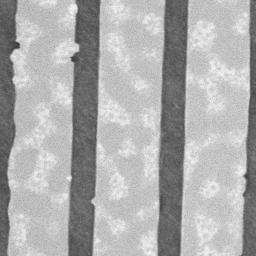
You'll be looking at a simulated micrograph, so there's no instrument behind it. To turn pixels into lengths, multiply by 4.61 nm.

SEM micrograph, one or a few lines or trenches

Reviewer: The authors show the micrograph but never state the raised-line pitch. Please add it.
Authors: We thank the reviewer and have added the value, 0.4 µm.